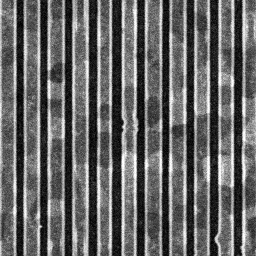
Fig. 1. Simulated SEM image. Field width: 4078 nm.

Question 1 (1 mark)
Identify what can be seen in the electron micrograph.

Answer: parallel lines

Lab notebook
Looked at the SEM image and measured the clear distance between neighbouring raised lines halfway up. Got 163 nanometers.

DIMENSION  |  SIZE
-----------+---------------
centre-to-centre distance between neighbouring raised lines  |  386 nm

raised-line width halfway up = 0.217 micrometres